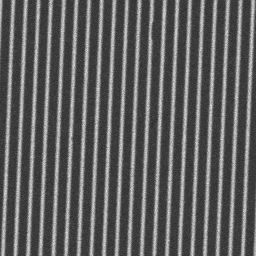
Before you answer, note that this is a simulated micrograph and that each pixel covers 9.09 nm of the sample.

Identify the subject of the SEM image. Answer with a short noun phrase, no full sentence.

parallel lines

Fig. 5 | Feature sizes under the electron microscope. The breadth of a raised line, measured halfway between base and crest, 31.8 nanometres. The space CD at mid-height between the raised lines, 86.2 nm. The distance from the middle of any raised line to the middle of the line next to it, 115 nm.